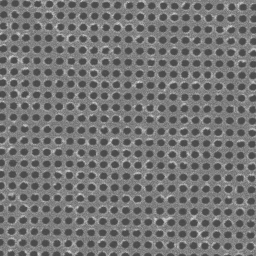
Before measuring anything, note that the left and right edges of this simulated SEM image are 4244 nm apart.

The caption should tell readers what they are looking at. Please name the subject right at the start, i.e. a regular array of holes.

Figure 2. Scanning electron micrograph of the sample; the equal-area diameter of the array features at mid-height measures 130 nm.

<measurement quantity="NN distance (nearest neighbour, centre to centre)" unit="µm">0.186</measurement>